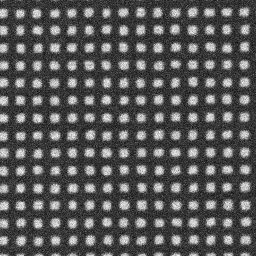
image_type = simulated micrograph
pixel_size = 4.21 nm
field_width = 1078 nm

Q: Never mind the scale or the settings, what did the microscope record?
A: a regular array of raised bodies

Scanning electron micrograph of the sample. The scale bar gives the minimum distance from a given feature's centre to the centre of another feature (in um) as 0.071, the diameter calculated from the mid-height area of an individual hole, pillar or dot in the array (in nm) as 38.